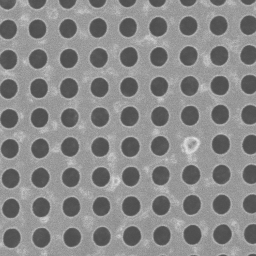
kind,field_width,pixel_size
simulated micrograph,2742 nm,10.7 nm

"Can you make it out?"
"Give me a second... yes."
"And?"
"a regular array of holes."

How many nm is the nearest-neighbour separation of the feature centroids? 317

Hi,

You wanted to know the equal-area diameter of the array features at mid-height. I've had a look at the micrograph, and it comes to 203 nm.